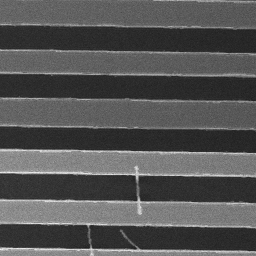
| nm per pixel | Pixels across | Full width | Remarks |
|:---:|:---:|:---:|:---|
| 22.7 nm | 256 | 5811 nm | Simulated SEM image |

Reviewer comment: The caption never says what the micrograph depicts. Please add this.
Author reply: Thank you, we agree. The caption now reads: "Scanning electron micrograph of lines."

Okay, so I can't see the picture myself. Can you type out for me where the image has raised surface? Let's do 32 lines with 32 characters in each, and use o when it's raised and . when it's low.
oooooooooooooooooooooooooooooooo
oooooooooooooooooooooooooooooooo
oooooooooooooooooooooooooooooooo
..............................oo
................................
................................
oooooooooooooooooooo............
oooooooooooooooooooooooooooooooo
oooooooooooooooooooooooooooooooo
........................oooooooo
................................
................................
ooooooooooooooo.................
oooooooooooooooooooooooooooooooo
oooooooooooooooooooooooooooooooo
oooooooooooooooooooooooooooooooo
................................
................................
................................
oooooooooooooooooooooooooooooooo
oooooooooooooooooooooooooooooooo
oooooooooooooooooooooooooooooooo
................................
................................
................................
oooooooooooooooooooooooooooooooo
oooooooooooooooooooooooooooooooo
oooooooooooooooooooooooooooooooo
................................
................................
................................
oooooooooooooooooooooooooooooooo